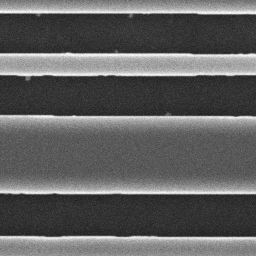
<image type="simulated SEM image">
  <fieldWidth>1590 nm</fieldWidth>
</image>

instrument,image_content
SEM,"lines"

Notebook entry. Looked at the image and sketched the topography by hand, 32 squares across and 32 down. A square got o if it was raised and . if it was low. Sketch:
oooooooooooooooooooooooooooooooo
oooooooooooooooooooooooooooooooo
................................
................................
................................
................................
................................
oooooooooooooooooooooooooooooooo
oooooooooooooooooooooooooooooooo
................................
................................
................................
................................
................................
ooooooo..o......................
oooooooooooooooooooooooooooooooo
oooooooooooooooooooooooooooooooo
oooooooooooooooooooooooooooooooo
oooooooooooooooooooooooooooooooo
oooooooooooooooooooooooooooooooo
oooooooooooooooooooooooooooooooo
oooooooooooooooooooooooooooooooo
oooooooooooooooooooooooooooooooo
oooooooooooooooooooooooooooooooo
................................
................................
................................
................................
................................
................................
oooooooooooooooooooooooooooooooo
oooooooooooooooooooooooooooooooo